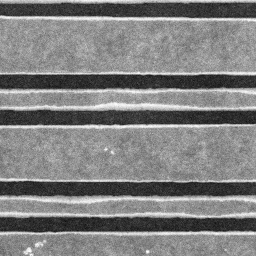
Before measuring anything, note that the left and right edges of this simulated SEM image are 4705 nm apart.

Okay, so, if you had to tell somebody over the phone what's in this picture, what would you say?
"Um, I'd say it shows lines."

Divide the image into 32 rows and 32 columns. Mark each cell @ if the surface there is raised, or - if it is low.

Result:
--------------------------------
--------------------------------
@@@@@@@@@@@@@@@@@@@@@@@@@@@@@@@@
@@@@@@@@@@@@@@@@@@@@@@@@@@@@@@@@
@@@@@@@@@@@@@@@@@@@@@@@@@@@@@@@@
@@@@@@@@@@@@@@@@@@@@@@@@@@@@@@@@
@@@@@@@@@@@@@@@@@@@@@@@@@@@@@@@@
@@@@@@@@@@@@@@@@@@@@@@@@@@@@@@@@
@@@@@@@@@@@@@@@@@@@@@@@@@@@@@@@@
--------------------------------
--------------------------------
@@@@@@@@@@@@@@@@@@@@@@@@@@@@@@@@
@@@@@@@@@@@@@@@@@@@@@@@@@@@@@@@@
@@@@@-@@@@@@@--------@@@@@@@@@@@
--------------------------------
--------------------------------
@@@@@@@@@@@@@@@@@@@@@@@@@@@@@@@@
@@@@@@@@@@@@@@@@@@@@@@@@@@@@@@@@
@@@@@@@@@@@@@@@@@@@@@@@@@@@@@@@@
@@@@@@@@@@@@@@@@@@@@@@@@@@@@@@@@
@@@@@@@@@@@@@@@@@@@@@@@@@@@@@@@@
@@@@@@@@@@@@@@@@@@@@@@@@@@@@@@@@
@@@@@@@@@@@@@@@@@@@@@@@@@@@@@@@@
--------------------------------
--------------------------------
@@@@@@@@@@@@@@@@@@@@@@@@@@@@@@@@
@@@@@@@@@@@@@@@@@@@@@@@@@@@@@@@@
--------------------------------
--------------------------------
@@@@@@@@@@@@@@@@@@@@@@@@@@@@@@@@
@@@@@@@@@@@@@@@@@@@@@@@@@@@@@@@@
@@@@@@@@@@@@@@@@@@@@@@@@@@@@@@@@